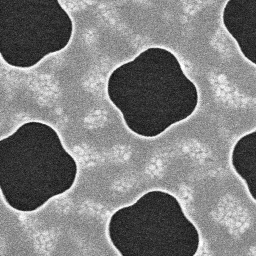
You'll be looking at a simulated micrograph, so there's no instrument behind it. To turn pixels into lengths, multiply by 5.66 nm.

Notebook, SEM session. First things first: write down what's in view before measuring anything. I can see holes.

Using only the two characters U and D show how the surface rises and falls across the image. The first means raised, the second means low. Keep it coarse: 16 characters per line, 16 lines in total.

DDDDUUUUUUUUUUDD
DDDDUUUUUUUUUUDD
DDDDUUUUUUUUUUUD
DDDUUUUUUDDUUUUD
UUUUUUUDDDDUUUUU
UUUUUUUDDDDDUUUU
UUUUUUUDDDDDUUUU
UUUUUUUUDDDUUUUU
UDDDUUUUUDUUUUUD
DDDDUUUUUUUUUUUD
DDDDDUUUUUUUUUUD
DDDDDUUUUUUUUUUD
DDDUUUUUUDDUUUUU
UUUUUUUDDDDDUUUU
UUUUUUUDDDDDUUUU
UUUUUUUDDDDDUUUU